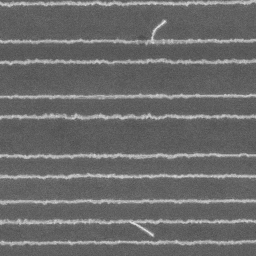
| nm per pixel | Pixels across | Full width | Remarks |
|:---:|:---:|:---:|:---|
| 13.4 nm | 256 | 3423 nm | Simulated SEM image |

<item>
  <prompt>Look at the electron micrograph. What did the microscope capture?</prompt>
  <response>lines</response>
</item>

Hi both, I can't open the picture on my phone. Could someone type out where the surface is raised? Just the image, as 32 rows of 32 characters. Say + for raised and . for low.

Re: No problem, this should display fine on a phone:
++...++..++..+.+.....+..........
................................
................................
................................
................................
++++++++++++++++++++++++++++++++
++++++++++++++++++++++++++++++++
++++++++++++++++++++++++++++++++
................................
................................
................................
................................
++++++++++++++++++++++++++++++++
++++++++++++++++++++++++++++++++
++++++++++++++++++++++++++++++++
................................
................................
................................
................................
+++.+++.++++++++++++++++++++++++
++++++++++++++++++++++++++++++++
++++++++++++++++++++++++++++++++
................................
................................
................................
++++++++++++++++++++++++++++++++
++++++++++++++++++++++++++++++++
++++++++++++++++++++++++++++++++
................................
................................
++++++++++++++++++++++++++++++++
++++++++++++++++++++++++++++++++